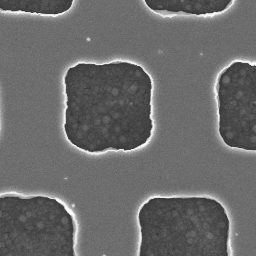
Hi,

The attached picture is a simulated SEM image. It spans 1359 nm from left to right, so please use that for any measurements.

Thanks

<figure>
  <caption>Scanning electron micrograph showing holes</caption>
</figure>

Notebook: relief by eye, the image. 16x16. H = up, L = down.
LLLLHHHHHLLLLLHH
HHHHHHHHHHHHHHHH
HHHHHHHHHHHHHHHH
HHHHHHHHHHHHHHHH
HHHHLLLLLHHHHHLL
HHHHLLLLLHHHHHLL
HHHHLLLLLHHHHHLL
HHHHLLLLLHHHHHLL
HHHHLLLLLHHHHHLL
HHHHHHHHHHHHHHHH
HHHHHHHHHHHHHHHH
HHHHHHHHHHHHHHHH
LLLHHHHHHLLLLHHH
LLLLHHHHHLLLLLHH
LLLLLHHHHLLLLLHH
LLLLLHHHHLLLLLHH